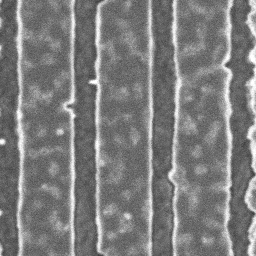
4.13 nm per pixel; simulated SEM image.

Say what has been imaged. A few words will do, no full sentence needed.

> one or a few lines or trenches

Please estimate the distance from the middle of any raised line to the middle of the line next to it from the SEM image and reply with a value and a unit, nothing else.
77.9 px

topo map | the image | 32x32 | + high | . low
..+++++++...+++++++...+++++++..+
..+++++++...+++++++...+++++++..+
..+++++++...+++++++...+++++++..+
..+++++++...+++++++...+++++++..+
..+++++++...+++++++...+++++++...
..+++++++...+++++++...+++++++...
..+++++++...+++++++...+++++++..+
..+++++++...+++++++...++++++...+
..+++++++...+++++++...++++++....
..+++++++...+++++++...+++++++...
..+++++++...+++++++...+++++++..+
..+++++++...+++++++...++++++...+
..+++++++...+++++++...+++++++..+
..+++++++...+++++++...+++++++..+
..+++++++...+++++++...+++++++...
..+++++++...+++++++...+++++++...
..+++++++...+++++++...+++++++..+
...++++++...+++++++...+++++++..+
...++++++...+++++++...+++++++..+
...++++++...+++++++...+++++++..+
...++++++...+++++++...+++++++..+
...++++++...+++++++..++++++++...
..+++++++...+++++++..++++++++..+
..+++++++...+++++++...+++++++..+
...++++++...+++++++...+++++++..+
..+++++++...+++++++...+++++++..+
..+++++++...+++++++...++++++....
..+++++++...+++++++...++++++....
..+++++++...+++++++...++++++...+
..+++++++...+++++++...+++++++..+
...++++++...+++++++...+++++++..+
..+++++++...+++++++...+++++++..+